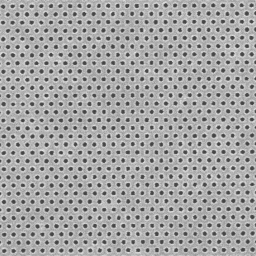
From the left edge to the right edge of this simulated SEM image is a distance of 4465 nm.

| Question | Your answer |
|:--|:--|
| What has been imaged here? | a regular array of holes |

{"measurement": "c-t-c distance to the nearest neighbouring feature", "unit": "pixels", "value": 9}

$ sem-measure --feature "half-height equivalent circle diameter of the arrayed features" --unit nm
78.7